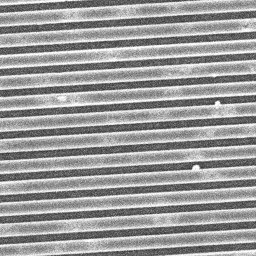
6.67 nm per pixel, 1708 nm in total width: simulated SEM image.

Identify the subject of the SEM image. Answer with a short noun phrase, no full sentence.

parallel lines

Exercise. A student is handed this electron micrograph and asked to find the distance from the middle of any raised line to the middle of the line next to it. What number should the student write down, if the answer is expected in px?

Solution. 21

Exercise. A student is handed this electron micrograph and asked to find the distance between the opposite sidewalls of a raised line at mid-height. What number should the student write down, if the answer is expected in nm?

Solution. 86.5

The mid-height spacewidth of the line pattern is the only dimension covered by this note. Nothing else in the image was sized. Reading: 57.4 nm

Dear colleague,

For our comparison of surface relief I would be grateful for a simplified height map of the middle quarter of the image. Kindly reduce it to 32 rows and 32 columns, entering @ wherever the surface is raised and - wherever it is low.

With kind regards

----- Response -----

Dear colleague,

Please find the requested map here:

--------------------------@@@@@@
-----------@@@@@@@@@@@@@@@@@@@@@
@@@@@@@@@@@@@@@@@@@@@@@@@@@@@@@@
@@@@@@@@@@@@@@@@@@@@@@@@@@------
@@@@@@@@@@@---------------------
--------------------------------
----------------@@@@@@@@@@@@@@@@
-@@@@@@@@@@@@@@@@@@@@@@@@@@@@@@@
@@@@@@@@@@@@@@@@@@@@@@@@@@@@@@@@
@@@@@@@@@@@@@@@@@---------------
@-------------------------------
-------------------@@@@@@@@@@@@@
---@@@@@@@@@@@@@@@@@@@@@@@@@@@@@
@@@@@@@@@@@@@@@@@@@@@@@@@@@@@@@@
@@@@@@@@@@@@@@@@@@@@------------
@@@@----------------------------
--------------------------@@@@@@
----------@@@@@@@@@@@@@@@@@@@@@@
@@@@@@@@@@@@@@@@@@@@@@@@@@@@@@@@
@@@@@@@@@@@@@@@@@@@@@@@@@@------
@@@@@@@@@@----------------------
----------------------------@@@@
-------------@@@@@@@@@@@@@@@@@@@
@@@@@@@@@@@@@@@@@@@@@@@@@@@@@@@@
@@@@@@@@@@@@@@@@@@@@@@@@@@@@@---
@@@@@@@@@@@@@-------------------
--------------------------------
-------------------@@@@@@@@@@@@@
---@@@@@@@@@@@@@@@@@@@@@@@@@@@@@
@@@@@@@@@@@@@@@@@@@@@@@@@@@@@@@@
@@@@@@@@@@@@@@@@----------------
--------------------------------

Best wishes